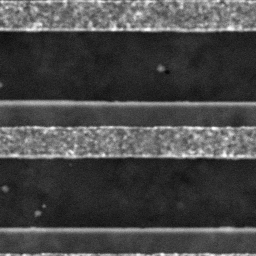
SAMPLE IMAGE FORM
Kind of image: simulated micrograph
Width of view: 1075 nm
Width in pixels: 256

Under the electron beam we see lines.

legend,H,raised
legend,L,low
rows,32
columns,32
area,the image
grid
HHHHHHHHHHHHHHHHHHHHHHHHHHHHHHHH
HHHHHHHHHHHHHHHHHHHHHHHHHHHHHHHH
HHHHHHHHHHHHHHHHHHHHHHHHHHHHHHHH
HHHHHHHHHHHHHHHHHHHHHHHHHHHHHHHH
LLLLLLLLLLLLLLLLLLLLLLLLLLLLLLLL
LLLLLLLLLLLLLLLLLLLLLLLLLLLLLLLL
LLLLLLLLLLLLLLLLLLLLLLLLLLLLLLLL
LLLLLLLLLLLLLLLLLLLLLLLLLLLLLLLL
LLLLLLLLLLLLLLLLLLLLLLLLLLLLLLLL
LLLLLLLLLLLLLLLLLLLLLLLLLLLLLLLL
LLLLLLLLLLLLLLLLLLLLLLLLLLLLLLLL
LLLLLLLLLLLLLLLLLLLLLLLLLLLLLLLL
LLLLLLLLLLLLLLLLLLLLLLLLLLLLLLLL
HHHHHHHHHHHHHHHHHHHHHHHHHHHHHHHH
HHHHHHHHHHHHHHHHHHHHHHHHHHHHHHHH
HHHHHHHHHHHHHHHHHHHHHHHHHHHHHHHH
HHHHHHHHHHHHHHHHHHHHHHHHHHHHHHHH
HHHHHHHHHHHHHHHHHHHHHHHHHHHHHHHH
HHHHHHHHHHHHHHHHHHHHHHHHHHHHHHHH
HHHHHHHHHHHHHHHHHHHHHHHHHHHHHHHH
LLLLLLLLLLLLLLLLLLLLLLLLLLLLLLLL
LLLLLLLLLLLLLLLLLLLLLLLLLLLLLLLL
LLLLLLLLLLLLLLLLLLLLLLLLLLLLLLLL
LLLLLLLLLLLLLLLLLLLLLLLLLLLLLLLL
LLLLLLLLLLLLLLLLLLLLLLLLLLLLLLLL
LLLLLLLLLLLLLLLLLLLLLLLLLLLLLLLL
LLLLLLLLLLLLLLLLLLLLLLLLLLLLLLLL
LLLLLLLLLLLLLLLLLLLLLLLLLLLLLLLL
LLLLLLLLLLLLLLLLLLLLLLLLLLLLLLLL
HHHHHHHHHHHHHHHHHHHHHHHHHHHHHHHH
HHHHHHHHHHHHHHHHHHHHHHHHHHHHHHHH
HHHHHHHHHHHHHHHHHHHHHHHHHHHHHHHH